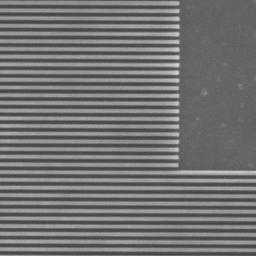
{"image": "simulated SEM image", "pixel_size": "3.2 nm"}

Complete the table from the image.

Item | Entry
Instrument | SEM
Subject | parallel lines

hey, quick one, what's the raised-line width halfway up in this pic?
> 12.8 nanometers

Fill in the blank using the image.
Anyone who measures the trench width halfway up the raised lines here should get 4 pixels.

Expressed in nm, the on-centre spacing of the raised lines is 24.6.